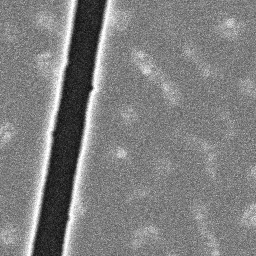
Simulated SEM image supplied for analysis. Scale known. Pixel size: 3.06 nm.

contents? one or a few lines or trenches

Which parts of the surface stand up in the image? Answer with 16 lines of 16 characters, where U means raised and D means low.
UUUUUDDUUUUUUUUU
UUUUUDUUUUUUUUUU
UUUUDDUUUUUUUUUU
UUUUDDUUUUUUUUUU
UUUUDDUUUUUUUUUU
UUUUDDUUUUUUUUUU
UUUUDDUUUUUUUUUU
UUUDDUUUUUUUUUUU
UUUDDUUUUUUUUUUU
UUUDDUUUUUUUUUUU
UUUDDUUUUUUUUUUU
UUUDDUUUUUUUUUUU
UUUDDUUUUUUUUUUU
UUDDUUUUUUUUUUUU
UUDDUUUUUUUUUUUU
UUDDUUUUUUUUUUUU